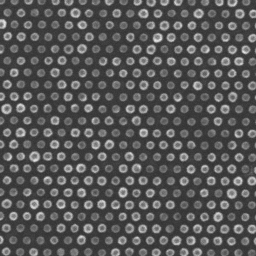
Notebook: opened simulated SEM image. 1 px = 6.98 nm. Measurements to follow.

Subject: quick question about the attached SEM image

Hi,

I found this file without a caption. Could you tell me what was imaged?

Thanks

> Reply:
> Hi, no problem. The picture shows a regular array of raised bodies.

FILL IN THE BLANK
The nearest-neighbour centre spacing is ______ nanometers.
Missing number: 92.9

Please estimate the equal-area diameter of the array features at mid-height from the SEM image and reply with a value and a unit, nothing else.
54.6 nanometers